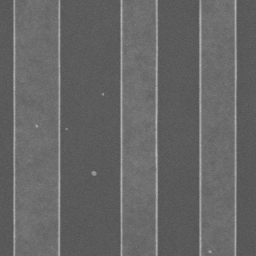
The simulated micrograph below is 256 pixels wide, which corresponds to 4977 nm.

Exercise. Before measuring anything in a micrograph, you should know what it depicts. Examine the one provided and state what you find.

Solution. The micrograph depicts groups of lines, slits or small figures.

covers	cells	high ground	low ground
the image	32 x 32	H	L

LLHHHHHLLLLLLLLHHHHHLLLLLHHHHLLL
LLHHHHHLLLLLLLLHHHHHLLLLLHHHHLLL
LLHHHHHLLLLLLLLHHHHHLLLLLHHHHLLL
LLHHHHHLLLLLLLLHHHHHLLLLLHHHHLLL
LLHHHHHLLLLLLLLHHHHHLLLLLHHHHLLL
LLHHHHHLLLLLLLLHHHHHLLLLLHHHHLLL
LLHHHHHLLLLLLLLHHHHHLLLLLHHHHLLL
LLHHHHHLLLLLLLLHHHHHLLLLLHHHHLLL
LLHHHHHLLLLLLLLHHHHHLLLLLHHHHLLL
LLHHHHHLLLLLLLLHHHHHLLLLLHHHHLLL
LLHHHHHLLLLLLLLHHHHHLLLLLHHHHLLL
LLHHHHHLLLLLLLLHHHHHLLLLLHHHHLLL
LLHHHHHLLLLLLLLHHHHHLLLLLHHHHLLL
LLHHHHHLLLLLLLLHHHHHLLLLLHHHHLLL
LLHHHHHLLLLLLLLHHHHHLLLLLHHHHLLL
LLHHHHHLLLLLLLLHHHHHLLLLLHHHHLLL
LLHHHHHLLLLLLLLHHHHHLLLLLHHHHLLL
LLHHHHHLLLLLLLLHHHHHLLLLLHHHHLLL
LLHHHHHLLLLLLLLHHHHHLLLLLHHHHLLL
LLHHHHHLLLLLLLLHHHHHLLLLLHHHHLLL
LLHHHHHLLLLLLLLHHHHHLLLLLHHHHLLL
LLHHHHHLLLLLLLLHHHHHLLLLLHHHHLLL
LLHHHHHLLLLLLLLHHHHHLLLLLHHHHLLL
LLHHHHHLLLLLLLLHHHHHLLLLLHHHHLLL
LLHHHHHLLLLLLLLHHHHHLLLLLHHHHLLL
LLHHHHHLLLLLLLLHHHHHLLLLLHHHHLLL
LLHHHHHLLLLLLLLHHHHHLLLLLHHHHLLL
LLHHHHHLLLLLLLLHHHHHLLLLLHHHHLLL
LLHHHHHLLLLLLLLHHHHHLLLLLHHHHLLL
LLHHHHHLLLLLLLLHHHHHLLLLLHHHHLLL
LLHHHHHLLLLLLLLHHHHHLLLLLHHHHLLL
LLHHHHHLLLLLLLLHHHHHLLLLLHHHHLLL